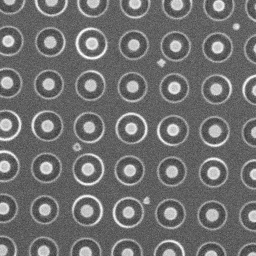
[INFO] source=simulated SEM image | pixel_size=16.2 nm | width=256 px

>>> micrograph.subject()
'an array of small figures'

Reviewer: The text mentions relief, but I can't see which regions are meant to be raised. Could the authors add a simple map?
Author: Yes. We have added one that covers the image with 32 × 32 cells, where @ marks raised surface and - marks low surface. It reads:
---@@---@@---@@----@----@@---@@-
--@@@---@@---@@@--@@@---@@---@@-
@@@@@@@@@@@@@@@@@@@@@@@@@@@@@@@@
--@@@@@@@@@@@@@@@@@@@@@@@@@@@@@@
---@@---@@---@@---@@@--@@@--@@@@
---@@---@@---@@---@@----@@---@@-
--@@@--@@@---@@---@@----@@---@@-
@@@@@@@@@@@@@@@@@@@@@@@@@@--@@@-
@@@@@@@@@@@@@@@@@@@@@@@@@@@@@@@@
--@@@--@@@---@@@--@@@--@@@@-@@@@
---@----@@---@@---@@---@@----@@-
--@@@---@@---@@---@@---@@----@@-
@@@@@@@@@@@@@@@@-@@@@--@@@--@@@-
@@@@@@@@@@@@@@@@@@@@@@@@@@@@@@@@
--@@@--@@@--@@@@-@@@@@@@@@@@@@@@
--@@----@----@@---@@---@@---@@@-
--@@----@----@@---@@---@@----@--
@@@@@@@@@@--@@@---@@---@@---@@@-
@@@@@@@@@@@@@@@@@@@@@@@@@@@@@@@@
--@@@--@@@--@@@@@@@@@@@@@@@@@@@@
--@@---@@----@@---@@---@@---@@@-
--@@---@@----@@---@@---@@---@@--
-@@@@--@@@--@@@--@@@---@@---@@--
@@@@@@@@@@@@@@@@@@@@@@@@@@@@@@@@
-@@@@@@@@@@@@@@@@@@@@@@@@@@@@@@@
--@@---@@---@@@--@@@---@@@--@@@-
--@@---@@----@----@@---@@---@@--
-@@@@--@@@--@@@---@@---@@---@@--
@@@@@@@@@@@@@@@@@@@@@@@@@@-@@@@-
@@@@@@@@@@@@@@@@@@@@@@@@@@@@@@@@
--@@---@@---@@@--@@@--@@@@-@@@@@
--@@---@@----@----@----@@---@@--